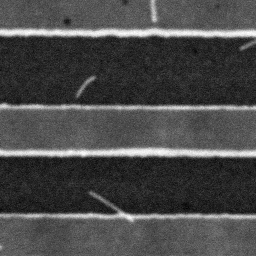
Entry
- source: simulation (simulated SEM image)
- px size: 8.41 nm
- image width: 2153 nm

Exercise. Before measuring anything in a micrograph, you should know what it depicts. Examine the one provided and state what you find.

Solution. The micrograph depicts lines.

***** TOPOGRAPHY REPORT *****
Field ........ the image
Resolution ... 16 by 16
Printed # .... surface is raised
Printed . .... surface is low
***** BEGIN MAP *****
################
################
................
................
................
................
................
################
################
################
................
................
................
################
################
################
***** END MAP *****